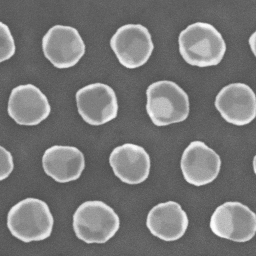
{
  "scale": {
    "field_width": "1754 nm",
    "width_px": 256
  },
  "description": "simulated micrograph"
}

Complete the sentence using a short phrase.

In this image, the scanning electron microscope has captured a regular array of raised bodies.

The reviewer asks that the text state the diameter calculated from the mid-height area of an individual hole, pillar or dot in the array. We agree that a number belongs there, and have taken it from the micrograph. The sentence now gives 0.271 um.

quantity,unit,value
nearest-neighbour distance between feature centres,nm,453